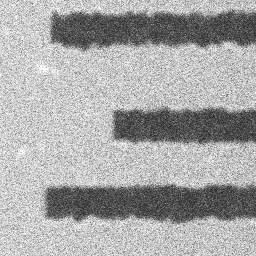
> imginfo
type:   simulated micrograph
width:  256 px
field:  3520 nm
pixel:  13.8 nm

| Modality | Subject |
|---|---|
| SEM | one or a few lines or trenches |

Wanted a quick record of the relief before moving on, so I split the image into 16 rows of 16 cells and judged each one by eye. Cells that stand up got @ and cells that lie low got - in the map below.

----------------
---@@@@@@@@@@@@@
---@@@@@@@@@@@@@
----------------
----------------
----------------
----------------
-------@@@@@@@@@
-------@@@@@@@@@
----------------
----------------
------@---@--@@@
---@@@@@@@@@@@@@
---@@@@@@@@@@@@@
----------------
----------------